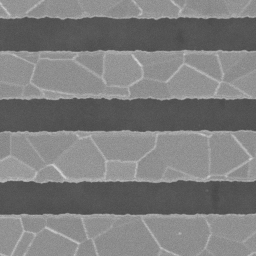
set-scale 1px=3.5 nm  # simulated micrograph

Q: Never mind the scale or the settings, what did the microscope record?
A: lines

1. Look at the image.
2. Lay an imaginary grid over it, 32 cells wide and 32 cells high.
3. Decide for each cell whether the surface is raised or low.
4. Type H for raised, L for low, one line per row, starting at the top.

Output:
HHHHHHHHHHHHHHHHHHHHHHHHHHHHHHHH
HHHHHHHHHHHHHHHHHHHHHHHHHHHHHHHH
LLLLLLLLLLLLLLLLLLLLLLLLLLLLLLLL
LLLLLLLLLLLLLLLLLLLLLLLLLLLLLLLL
LLLLLLLLLLLLLLLLLLLLLLLLLLLLLLLL
LLLLLLLLLLLLLLLLLLLLLLLLLLLLLLLL
HHHHLHHHHLHHHHHHHHLHHHHHHHHHHHHH
HHHHHHHHHHHHHHHHHHHHHHHHHHHHHHHH
HHHHHHHHHHHHHHHHHHHHHHHHHHHHHHHH
HHHHHHHHHHHHHHHHHHHHHHHHHHHHHHHH
HHHHHHHHHHHHHHHHHHHHHHHHHHHHHHHH
HHHHHHHHHHHHHHHHHHHHHHHHHHHHHHHH
LLLLLLLLLLLLLLLLLLLLLLLLLLLLLLLL
LLLLLLLLLLLLLLLLLLLLLLLLLLLLLLLL
LLLLLLLLLLLLLLLLLLLLLLLLLLLLLLLL
LLLLLLLLLLLLLLLLLLLLLLLLLLLLLLLL
HLLLLHLHHHHHHHHHHLHHHHHHHHHHHHHH
HHHHHHHHHHHHHHHHHHHHHHHHHHHHHHHH
HHHHHHHHHHHHHHHHHHHHHHHHHHHHHHHH
HHHHHHHHHHHHHHHHHHHHHHHHHHHHHHHH
HHHHHHHHHHHHHHHHHHHHHHHHHHHHHHHH
HHHHHHHHHHHHHHHHHHHHHHHHHHHHHHHH
HHHHHHHHHHHHHHHHHHHHHHHHHHHHHHHH
LLLLLLLLLLLLLLLLLLLLLLLLLLLLLLLL
LLLLLLLLLLLLLLLLLLLLLLLLLLLLLLLL
LLLLLLLLLLLLLLLLLLLLLLLLLLLLLLLL
LLLLLLLLLLLLLLLLLLLLLLLLLLLLLLLL
HHHHHHHHHHHHHHHHHHHHHHHHHHHHHHHH
HHHHHHHHHHHHHHHHHHHHHHHHHHHHHHHH
HHHHHHHHHHHHHHHHHHHHHHHHHHHHHHHH
HHHHHHHHHHHHHHHHHHHHHHHHHHHHHHHH
HHHHHHHHHHHHHHHHHHHHHHHHHHHHHHHH